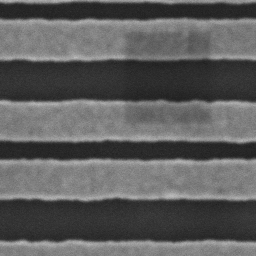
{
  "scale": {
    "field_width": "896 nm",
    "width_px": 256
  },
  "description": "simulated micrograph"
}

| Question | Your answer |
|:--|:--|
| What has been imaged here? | lines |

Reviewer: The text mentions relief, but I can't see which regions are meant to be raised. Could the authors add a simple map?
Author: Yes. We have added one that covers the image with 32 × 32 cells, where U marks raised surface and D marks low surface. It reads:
DDDDDDDDDDDDDDDDDDDDDDDDDDDDDDDD
DDDDDDDDDDDDDDDDDDDDDDDDDDDDDDDD
UDUUUUDDDDUUDDDDDDDUUUUUUDUDUUUU
UUUUUUUUUUUUUUUUUUUUUUUUUUUUUUUU
UUUUUUUUUUUUUUUUUUUUUUUUUUUUUUUU
UUUUUUUUUUUUUUUUUUUUUUUUUUUUUUUU
UUUUUUUUUUUUUUUUUUUUUUUUUUUUUUUU
DDDDUUUUUDUUDDDDDDDDDDDDDDDDDDDD
DDDDDDDDDDDDDDDDDDDDDDDDDDDDDDDD
DDDDDDDDDDDDDDDDDDDDDDDDDDDDDDDD
DDDDDDDDDDDDDDDDDDDDDDDDDDDDDDDD
DDDDDDDDDDDDDDDDDDDDDDDDDDDDDDDD
DDDDDDDDDDUDDDDDDDDDDDDDDDDDDDDD
UUUUUUUUUUUUUUUUUUUUUUUUUUUUUUUU
UUUUUUUUUUUUUUUUUUUUUUUUUUUUUUUU
UUUUUUUUUUUUUUUUUUUUUUUUUUUUUUUU
UUUUUUUUUUUUUUUUUUUUUUUUUUUUUUUU
DUUUUUUUUUUUUDDDUUUUDDDUUUUUUUUU
DDDDDDDDDDDDDDDDDDDDDDDDDDDDDDDD
DDDDDDDDDDDDDDDDDDDDDDDDDDDDDDDD
UUUUUUUUUUUUUUUUUUUUUUUUUUUUUUUU
UUUUUUUUUUUUUUUUUUUUUUUUUUUUUUUU
UUUUUUUUUUUUUUUUUUUUUUUUUUUUUUUU
UUUUUUUUUUUUUUUUUUUUUUUUUUUUUUUU
UUUUUUUUUUUUUUUUUUUUUUUUUUUUUUUU
DDDDDDDDDDDDDDDDDDDDDDDDDDDDDDDD
DDDDDDDDDDDDDDDDDDDDDDDDDDDDDDDD
DDDDDDDDDDDDDDDDDDDDDDDDDDDDDDDD
DDDDDDDDDDDDDDDDDDDDDDDDDDDDDDDD
DDDDDDDDDDDDDDDDDDDDDDDDDDDDDDDD
UUUUUUUUUUUUUUUUUUUUUUUUUUUUUUUU
UUUUUUUUUUUUUUUUUUUUUUUUUUUUUUUU